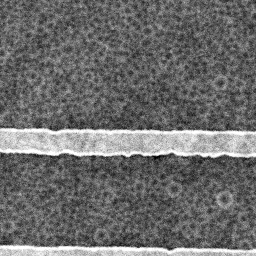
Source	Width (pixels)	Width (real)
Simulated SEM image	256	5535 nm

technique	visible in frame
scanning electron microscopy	one or a few lines or trenches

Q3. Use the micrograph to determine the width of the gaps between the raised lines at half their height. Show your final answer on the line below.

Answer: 95.1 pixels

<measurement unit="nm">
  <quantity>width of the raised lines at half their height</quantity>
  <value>480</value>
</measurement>